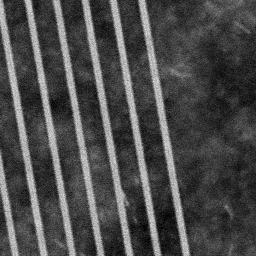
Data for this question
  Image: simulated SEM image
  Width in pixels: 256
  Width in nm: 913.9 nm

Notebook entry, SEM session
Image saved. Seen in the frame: parallel lines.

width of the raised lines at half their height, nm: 16.2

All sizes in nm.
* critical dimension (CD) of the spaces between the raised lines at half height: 85.3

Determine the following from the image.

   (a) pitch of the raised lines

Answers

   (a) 100 nm